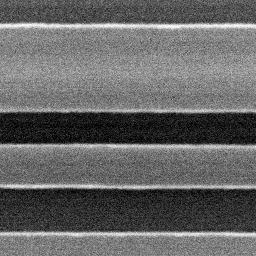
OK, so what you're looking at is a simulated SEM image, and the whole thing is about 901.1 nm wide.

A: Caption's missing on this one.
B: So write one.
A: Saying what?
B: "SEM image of lines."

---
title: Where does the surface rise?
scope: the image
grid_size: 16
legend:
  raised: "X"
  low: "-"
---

----------------
----------------
XXXXXXXXXXXXXXXX
XXXXXXXXXXXXXXXX
XXXXXXXXXXXXXXXX
XXXXXXXXXXXXXXXX
XXXXXXXXXXXXXXXX
----------------
----------------
XXXXXXXXXXXXXXXX
XXXXXXXXXXXXXXXX
XXXXXXXXXXXXXXXX
----------------
----------------
----------------
XXXXXXXXXXXXXXXX